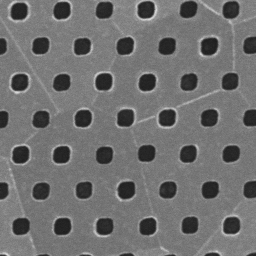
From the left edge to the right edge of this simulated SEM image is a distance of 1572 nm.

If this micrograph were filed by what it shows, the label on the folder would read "a regular array of holes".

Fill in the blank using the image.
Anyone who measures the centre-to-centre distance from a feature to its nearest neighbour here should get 253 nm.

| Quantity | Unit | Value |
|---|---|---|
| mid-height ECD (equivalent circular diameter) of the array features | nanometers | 116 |